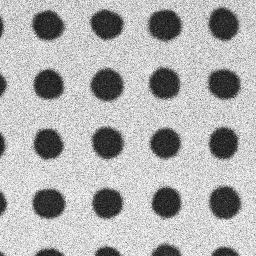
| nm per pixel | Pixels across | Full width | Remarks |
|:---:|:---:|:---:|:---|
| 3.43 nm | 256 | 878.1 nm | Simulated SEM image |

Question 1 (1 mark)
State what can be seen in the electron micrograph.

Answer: a regular array of holes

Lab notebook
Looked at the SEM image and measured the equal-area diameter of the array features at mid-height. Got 106 nm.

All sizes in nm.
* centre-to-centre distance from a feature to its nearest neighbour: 201